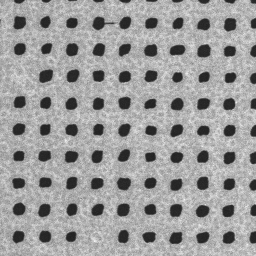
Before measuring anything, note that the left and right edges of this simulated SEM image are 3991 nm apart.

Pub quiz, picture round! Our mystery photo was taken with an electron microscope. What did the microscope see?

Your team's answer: a regular array of holes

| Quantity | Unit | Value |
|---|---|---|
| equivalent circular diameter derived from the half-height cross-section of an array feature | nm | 193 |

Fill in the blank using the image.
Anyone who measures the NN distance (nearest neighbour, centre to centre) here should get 401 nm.